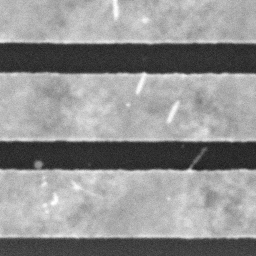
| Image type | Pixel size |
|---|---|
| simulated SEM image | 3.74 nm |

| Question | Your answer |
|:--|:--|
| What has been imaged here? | lines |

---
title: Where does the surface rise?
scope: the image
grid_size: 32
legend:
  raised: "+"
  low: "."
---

++++++++++++++++++++++++++++++++
++++++++++++++++++++++++++++++++
++++++++++++++++++++++++++++++++
++++++++++++++++++++++++++++++++
++++++++++++++++++++++++++++++++
................................
................................
................................
................................
++++++++++++++++++++++++++++++++
++++++++++++++++++++++++++++++++
++++++++++++++++++++++++++++++++
++++++++++++++++++++++++++++++++
++++++++++++++++++++++++++++++++
++++++++++++++++++++++++++++++++
++++++++++++++++++++++++++++++++
++++++++++++++++++++++++++++++++
+++++++.++++++++++++++++++++++++
................................
................................
................................
++++++++++++++++++++++++++++++++
++++++++++++++++++++++++++++++++
++++++++++++++++++++++++++++++++
++++++++++++++++++++++++++++++++
++++++++++++++++++++++++++++++++
++++++++++++++++++++++++++++++++
++++++++++++++++++++++++++++++++
++++++++++++++++++++++++++++++++
++++++++++++++++++++++++++++++++
................................
................................